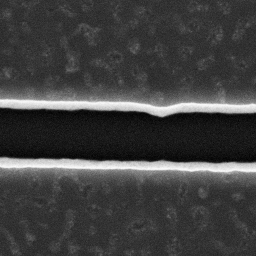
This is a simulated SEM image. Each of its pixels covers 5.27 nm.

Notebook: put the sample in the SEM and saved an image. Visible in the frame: one or a few lines or trenches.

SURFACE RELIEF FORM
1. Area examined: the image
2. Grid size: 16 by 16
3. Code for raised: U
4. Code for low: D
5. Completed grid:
UUUUUUUUUUUUUUUU
UUUUUUUUUUUUUUUU
UUUUUUUUUUUUUUUU
UUUUUUUUUUUUUUUU
UUUUUUUUUUUUUUUU
UUUUUUUUUUUUUUUU
DUUUUUUUUUUUUUUU
DDDDDDDDDDDDDDDD
DDDDDDDDDDDDDDDD
DDDDDDDDDDDDDDDD
UUUUUUUUUUUUUUUU
UUUUUUUUUUUUUUUU
UUUUUUUUUUUUUUUU
UUUUUUUUUUUUUUUU
UUUUUUUUUUUUUUUU
UUUUUUUUUUUUUUUU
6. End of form